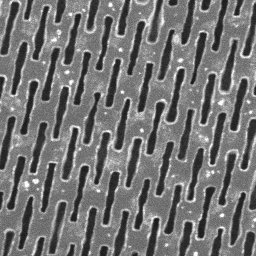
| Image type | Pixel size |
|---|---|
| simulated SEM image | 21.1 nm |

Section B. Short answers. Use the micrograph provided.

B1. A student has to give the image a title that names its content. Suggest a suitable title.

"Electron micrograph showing a regular array of holes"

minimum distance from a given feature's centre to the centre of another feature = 671 nm